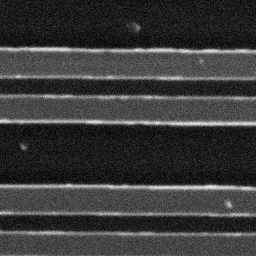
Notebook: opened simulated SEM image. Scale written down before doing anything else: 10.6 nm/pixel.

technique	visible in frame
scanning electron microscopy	lines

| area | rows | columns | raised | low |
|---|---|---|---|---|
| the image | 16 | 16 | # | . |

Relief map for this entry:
................
................
................
################
################
################
################
################
................
................
................
................
################
################
################
################